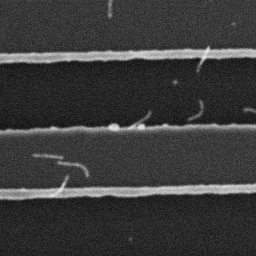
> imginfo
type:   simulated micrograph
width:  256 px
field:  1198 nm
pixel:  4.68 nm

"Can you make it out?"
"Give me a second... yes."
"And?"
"lines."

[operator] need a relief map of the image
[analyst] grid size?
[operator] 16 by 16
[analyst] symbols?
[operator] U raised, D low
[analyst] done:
UUUUUUUUUUUUUUUU
UUUUUUUUUUUUUUUU
UUUUUUUUUUUUUUUU
UUUUUUUUUUUUUUUU
DDDDDDDDDDDDDDDD
DDDDDDDDDDDDDDDD
DDDDDDDDDDDDDDDD
DDDDDDDDDDDDDDDD
UUUUUUUUUUUUUUUU
UUUUUUUUUUUUUUUU
UUUUUUUUUUUUUUUU
UUUUUUUUUUUUUUUU
DDDDDDDDDDDDDDDD
DDDDDDDDDDDDDDDD
DDDDDDDDDDDDDDDD
DDDDDDDDDDDDDDDD